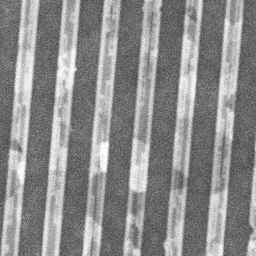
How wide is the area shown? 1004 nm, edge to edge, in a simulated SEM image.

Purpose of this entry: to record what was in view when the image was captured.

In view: parallel lines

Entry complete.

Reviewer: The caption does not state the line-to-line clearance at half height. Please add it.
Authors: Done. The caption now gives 27.9 pixels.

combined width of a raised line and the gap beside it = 160 nm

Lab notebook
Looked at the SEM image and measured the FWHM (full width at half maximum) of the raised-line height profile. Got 51.3 nm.